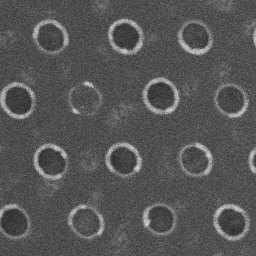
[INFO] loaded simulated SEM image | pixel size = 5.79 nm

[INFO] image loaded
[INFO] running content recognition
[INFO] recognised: a regular array of holes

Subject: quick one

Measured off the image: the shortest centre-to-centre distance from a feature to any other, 402 nm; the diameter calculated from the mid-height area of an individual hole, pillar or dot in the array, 27.3 px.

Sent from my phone